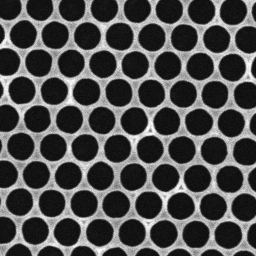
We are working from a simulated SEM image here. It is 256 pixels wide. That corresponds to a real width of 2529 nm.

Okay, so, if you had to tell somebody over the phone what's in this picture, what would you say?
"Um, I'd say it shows a regular array of holes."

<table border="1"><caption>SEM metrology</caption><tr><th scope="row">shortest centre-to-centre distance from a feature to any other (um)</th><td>0.315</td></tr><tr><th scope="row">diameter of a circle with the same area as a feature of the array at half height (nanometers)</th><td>272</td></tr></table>